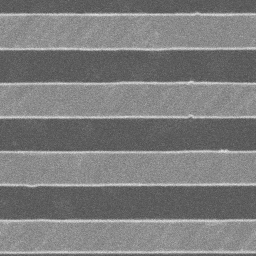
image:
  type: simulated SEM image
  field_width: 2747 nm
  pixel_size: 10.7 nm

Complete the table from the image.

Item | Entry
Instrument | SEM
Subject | one or a few lines or trenches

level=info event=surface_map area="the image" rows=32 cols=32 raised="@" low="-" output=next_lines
--------------------------------
--------------------------------
@@@@@@@@@@@@@@@@@@@@@@@@@@@@@@@@
@@@@@@@@@@@@@@@@@@@@@@@@@@@@@@@@
@@@@@@@@@@@@@@@@@@@@@@@@@@@@@@@@
@@@@@@@@@@@@@@@@@@@@@@@@@@@@@@@@
--------------------------------
--------------------------------
--------------------------------
--------------------------------
@@@@@@@@@@@@@@@@@@@@@@@@@@@@@@@@
@@@@@@@@@@@@@@@@@@@@@@@@@@@@@@@@
@@@@@@@@@@@@@@@@@@@@@@@@@@@@@@@@
@@@@@@@@@@@@@@@@@@@@@@@@@@@@@@@@
@@@@@@@@@@@@@@@@@@@@@@@@@@@@@@@@
--------------------------------
--------------------------------
--------------------------------
--------------------------------
@@@@@@@@@@@@@@@@@@@@@@@@@@@@@@@@
@@@@@@@@@@@@@@@@@@@@@@@@@@@@@@@@
@@@@@@@@@@@@@@@@@@@@@@@@@@@@@@@@
@@@@@@@@@@@@@@@@@@@@@@@@@@@@@@@@
--------------------------------
--------------------------------
--------------------------------
--------------------------------
--------------------------------
@@@@@@@@@@@@@@@@@@@@@@@@@@@@@@@@
@@@@@@@@@@@@@@@@@@@@@@@@@@@@@@@@
@@@@@@@@@@@@@@@@@@@@@@@@@@@@@@@@
@@@@@@@@@@@@-@@@@@@@@@@@@@@@@@@@